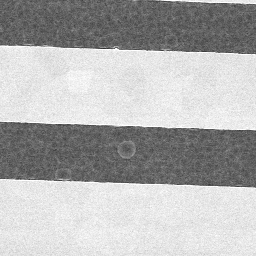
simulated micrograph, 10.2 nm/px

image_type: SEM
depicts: one or a few lines or trenches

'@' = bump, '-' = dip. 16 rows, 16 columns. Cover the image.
----------------
----------------
----------@-----
@@@@@@@@@@@@@@@@
@@@@@@@@@@@@@@@@
@@@@@@@@@@@@@@@@
@@@@@@@@@@@@@@@@
@@@@@@@@@@@@@@@@
----------------
----------------
----------------
@@@@@@@@@--@-@--
@@@@@@@@@@@@@@@@
@@@@@@@@@@@@@@@@
@@@@@@@@@@@@@@@@
@@@@@@@@@@@@@@@@